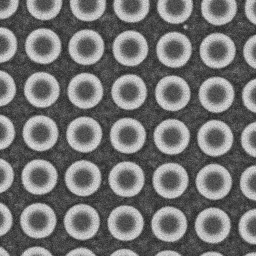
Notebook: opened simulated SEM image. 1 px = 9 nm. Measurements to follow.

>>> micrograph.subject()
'an array of small figures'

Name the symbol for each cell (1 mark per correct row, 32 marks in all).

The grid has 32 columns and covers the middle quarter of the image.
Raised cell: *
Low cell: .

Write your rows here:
..........................***...
................................
....**..........................
..******......*****......****...
..*******....*******....******..
.********...********...********.
.*********..*********..********.
.*********..*********..********.
.********...********...********.
..*******....*******...********.
...*****......*****.....******..
..........................**....
................................
....***.........................
..******.....******......****...
.********...********...*******..
.********...********...********.
.********...********...********.
.********...********...********.
.********...********...********.
..******....*******....********.
...****......******.....******..
................................
................................
...***.........*................
..******.....******.....*****...
.********...*******....*******..
*********..*********...********.
*********..*********..*********.
.********..*********..*********.
.********...********...********.
..******....*******....*******..